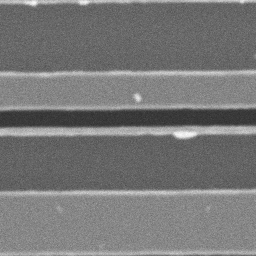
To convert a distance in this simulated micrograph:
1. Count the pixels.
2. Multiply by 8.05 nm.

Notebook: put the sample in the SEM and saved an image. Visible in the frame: lines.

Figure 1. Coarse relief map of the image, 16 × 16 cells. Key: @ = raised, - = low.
----------------
----------------
----------------
----------------
----------------
@@@@@@@@@@@@@@@@
@@@@@@@@@@@@@@@@
----------------
-----------@----
----------------
----------------
----------------
@@@@@@@@@@@@@@@@
@@@@@@@@@@@@@@@@
@@@@@@@@@@@@@@@@
@@@@@@@@@@@@@@@@